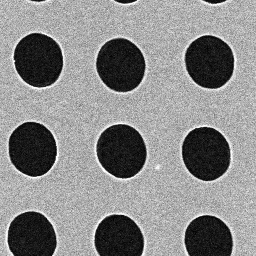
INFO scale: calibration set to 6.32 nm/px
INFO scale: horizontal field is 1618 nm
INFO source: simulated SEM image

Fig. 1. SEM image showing holes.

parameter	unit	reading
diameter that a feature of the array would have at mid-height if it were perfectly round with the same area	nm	325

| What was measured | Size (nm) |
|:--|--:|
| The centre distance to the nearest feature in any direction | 534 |